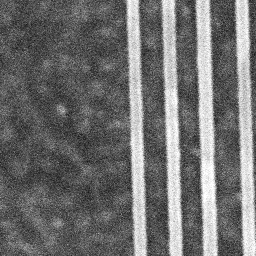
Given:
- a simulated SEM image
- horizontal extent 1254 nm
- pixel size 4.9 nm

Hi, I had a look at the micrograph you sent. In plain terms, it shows parallel lines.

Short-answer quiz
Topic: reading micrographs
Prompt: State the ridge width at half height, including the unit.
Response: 53.8 nm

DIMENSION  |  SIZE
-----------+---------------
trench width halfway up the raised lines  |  123 nanometres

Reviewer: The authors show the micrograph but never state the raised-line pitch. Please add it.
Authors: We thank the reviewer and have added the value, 176 nanometres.